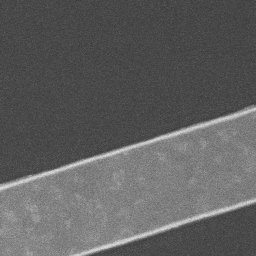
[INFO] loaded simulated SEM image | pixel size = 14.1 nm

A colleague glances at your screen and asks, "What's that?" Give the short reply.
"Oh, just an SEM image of one or a few lines or trenches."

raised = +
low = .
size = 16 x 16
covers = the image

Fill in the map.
................
................
................
................
................
................
................
..............++
..........++++++
.......+++++++++
....++++++++++++
.+++++++++++++++
++++++++++++++++
+++++++++++++...
++++++++++......
++++++..........